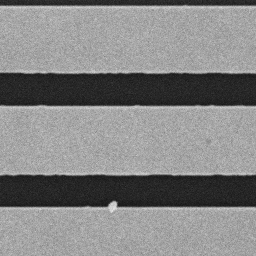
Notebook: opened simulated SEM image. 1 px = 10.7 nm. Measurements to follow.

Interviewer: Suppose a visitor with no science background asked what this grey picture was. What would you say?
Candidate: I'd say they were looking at lines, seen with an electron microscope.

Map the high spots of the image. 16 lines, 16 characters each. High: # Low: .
################
################
################
################
################
................
................
################
################
################
################
................
................
################
################
################